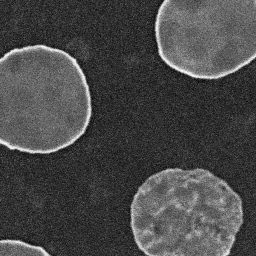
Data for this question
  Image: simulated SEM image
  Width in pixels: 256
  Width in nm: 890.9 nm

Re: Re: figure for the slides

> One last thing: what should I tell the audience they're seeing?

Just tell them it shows raised bodies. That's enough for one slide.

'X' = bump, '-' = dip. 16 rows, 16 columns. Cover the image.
----------XXXXXX
----------XXXXXX
----------XXXXXX
XXXX------XXXXXX
XXXXX------XXX--
XXXXX-----------
XXXXXX----------
XXXXXX----------
XXXXX-----------
--X-------------
----------------
----------------
----------------
----------------
----------------
XX--------------